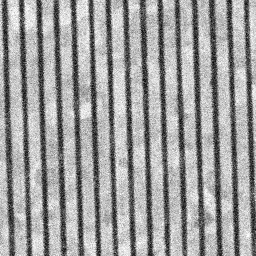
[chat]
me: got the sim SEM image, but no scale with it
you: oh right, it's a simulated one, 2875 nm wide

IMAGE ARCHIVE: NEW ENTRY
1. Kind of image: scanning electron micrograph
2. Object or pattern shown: parallel lines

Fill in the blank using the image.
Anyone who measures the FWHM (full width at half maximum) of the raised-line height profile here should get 125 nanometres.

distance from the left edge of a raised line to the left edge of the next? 0.194 microns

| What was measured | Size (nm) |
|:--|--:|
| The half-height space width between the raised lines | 70.2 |